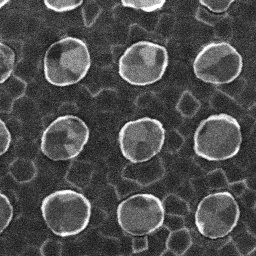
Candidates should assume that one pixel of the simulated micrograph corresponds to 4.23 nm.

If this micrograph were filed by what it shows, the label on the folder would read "a regular array of raised bodies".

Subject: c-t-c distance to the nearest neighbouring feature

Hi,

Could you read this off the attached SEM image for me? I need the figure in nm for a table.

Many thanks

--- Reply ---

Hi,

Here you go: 316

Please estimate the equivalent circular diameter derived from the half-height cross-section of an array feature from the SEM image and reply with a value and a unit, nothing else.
0.188 microns